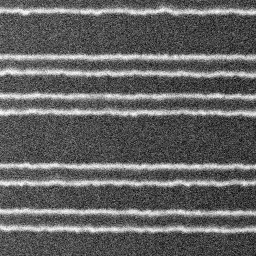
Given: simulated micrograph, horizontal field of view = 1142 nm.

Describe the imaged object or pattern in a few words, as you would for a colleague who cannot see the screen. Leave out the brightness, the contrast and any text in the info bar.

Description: lines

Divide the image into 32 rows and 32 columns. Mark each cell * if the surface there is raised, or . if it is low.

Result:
********************************
...*......***...****.********.**
................................
................................
................................
................................
................................
********************************
********************************
........................***....*
................................
................................
********************************
********************************
................................
................................
................................
................................
................................
................................
................................
********************************
********************************
................................
................................
................................
*****************.*..**........*
********************************
********************************
................................
................................
................................